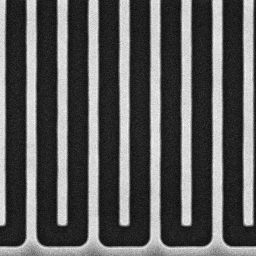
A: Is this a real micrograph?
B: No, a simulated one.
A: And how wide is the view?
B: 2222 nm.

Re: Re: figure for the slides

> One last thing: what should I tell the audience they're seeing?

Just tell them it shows groups of lines, slits or small figures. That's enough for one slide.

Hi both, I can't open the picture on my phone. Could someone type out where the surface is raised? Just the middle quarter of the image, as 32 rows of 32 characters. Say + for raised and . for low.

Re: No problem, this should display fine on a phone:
+.....++......++......++......++
+.....++......++......++......++
+.....++......++......++......++
+.....++......++......++......++
+.....++......++......++......++
+.....++......++......++......++
+.....++......++......++......++
+.....++......++......++......++
+.....++......++......++......++
+.....++......++......++......++
+.....++......++......++......++
+.....++......++......++......++
+.....++......++......++......++
+.....++......++......++......++
+.....++......++......++......++
+.....++......++......++......++
+.....++......++......++......++
+.....++......++......++......++
+.....++......++......++......++
+.....++......++......++......++
+.....++......++......++......++
+.....++......++......++......++
+.....++......++......++......++
+.....++......++......++......++
+.....++......++......++......++
+.....++......++......++......++
+.....++......++......++......++
+.....++......++......++......++
+.....++......++......++......++
+.....++......++......++......++
+.....++......++......++......++
+.....++......++......++......++